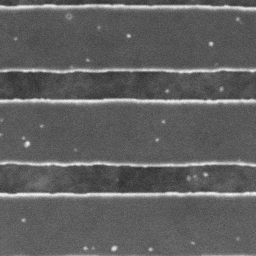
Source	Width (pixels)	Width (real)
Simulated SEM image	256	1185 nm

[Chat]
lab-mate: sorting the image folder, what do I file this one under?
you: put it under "lines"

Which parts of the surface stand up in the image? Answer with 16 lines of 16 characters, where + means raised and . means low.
++++++++++++++++
++++++++++++++++
++++++++++++++++
++++++++++++++++
...+.......+....
................
++++++++++++++++
++++++++++++++++
++++++++++++++++
++++++++++++++++
................
................
++++++++++++++++
++++++++++++++++
++++++++++++++++
++++++++++++++++